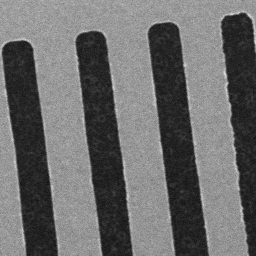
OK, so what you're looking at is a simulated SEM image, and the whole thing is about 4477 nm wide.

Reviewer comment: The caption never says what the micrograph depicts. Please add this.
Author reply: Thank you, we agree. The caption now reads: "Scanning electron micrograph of one or a few lines or trenches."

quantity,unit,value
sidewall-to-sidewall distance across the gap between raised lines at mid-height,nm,566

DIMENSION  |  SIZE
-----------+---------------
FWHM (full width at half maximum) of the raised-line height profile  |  716 nm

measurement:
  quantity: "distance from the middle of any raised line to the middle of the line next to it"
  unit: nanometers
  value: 1280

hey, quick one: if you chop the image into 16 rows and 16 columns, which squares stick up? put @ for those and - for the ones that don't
@@@@@@@@@@@@@@@@
@@@@@@@@@@-@@@--
@@@@@--@@--@@@--
--@@@--@@--@@@--
--@@@--@@@--@@--
--@@@--@@@--@@--
---@@--@@@--@@--
@--@@--@@@--@@--
@--@@--@@@--@@@-
@--@@@--@@--@@@-
@--@@@--@@--@@@-
@--@@@--@@--@@@-
@--@@@--@@@--@@-
@--@@@--@@@--@@-
@---@@--@@@--@@-
@@--@@--@@@--@@-